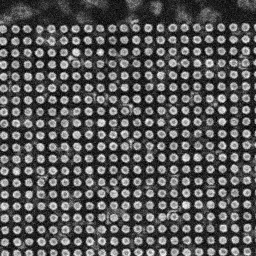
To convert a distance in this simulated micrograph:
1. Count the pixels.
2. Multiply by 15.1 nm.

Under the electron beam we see a regular array of raised bodies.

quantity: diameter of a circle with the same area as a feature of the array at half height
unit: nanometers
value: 102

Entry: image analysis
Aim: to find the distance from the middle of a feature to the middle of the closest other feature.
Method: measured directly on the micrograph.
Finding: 174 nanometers